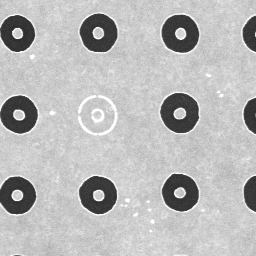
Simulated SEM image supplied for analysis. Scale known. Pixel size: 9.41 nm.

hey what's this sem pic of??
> ring-shaped grooves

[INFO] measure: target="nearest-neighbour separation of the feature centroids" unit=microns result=0.751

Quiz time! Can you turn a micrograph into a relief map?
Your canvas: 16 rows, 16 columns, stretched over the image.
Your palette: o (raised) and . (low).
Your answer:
oooooooooooooooo
..ooo..ooo..ooo.
..ooo..ooo..ooo.
oooooooooooooooo
oooooooooooooooo
oooooooooooooooo
..oooooooo..ooo.
..oooooooo..ooo.
oooooooooooooooo
oooooooooooooooo
oooooooooooooooo
..ooo..ooo..ooo.
..ooo..ooo..ooo.
oooooooooooooooo
oooooooooooooooo
oooooooooooooooo